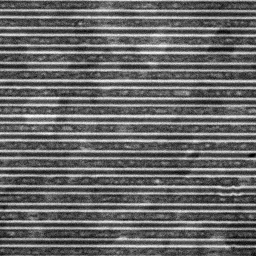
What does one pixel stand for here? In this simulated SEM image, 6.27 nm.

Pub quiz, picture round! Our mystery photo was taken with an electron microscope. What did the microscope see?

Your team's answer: parallel lines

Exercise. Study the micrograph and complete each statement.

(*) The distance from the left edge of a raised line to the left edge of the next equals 110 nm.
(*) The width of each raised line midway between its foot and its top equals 49.3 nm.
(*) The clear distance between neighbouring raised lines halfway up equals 61.1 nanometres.